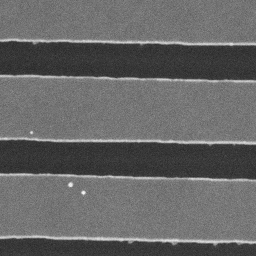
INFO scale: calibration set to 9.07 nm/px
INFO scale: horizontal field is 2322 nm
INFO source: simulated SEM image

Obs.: lines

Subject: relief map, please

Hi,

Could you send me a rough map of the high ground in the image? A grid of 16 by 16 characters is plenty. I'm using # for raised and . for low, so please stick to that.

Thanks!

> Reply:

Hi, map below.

################
################
################
................
................
################
################
################
################
................
................
################
################
################
################
................